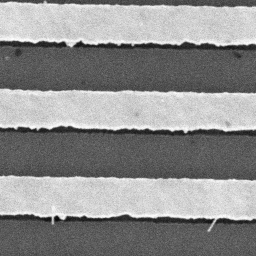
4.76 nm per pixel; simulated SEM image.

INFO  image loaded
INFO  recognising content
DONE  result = lines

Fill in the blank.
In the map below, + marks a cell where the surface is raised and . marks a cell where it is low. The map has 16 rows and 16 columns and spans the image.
++++++++++++++++
++++++++++++++++
++++++++++++++++
................
................
................
++++++++++++++++
++++++++++++++++
................
................
................
++++++++++++++++
++++++++++++++++
..+++++.++++++++
................
................